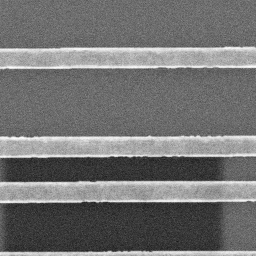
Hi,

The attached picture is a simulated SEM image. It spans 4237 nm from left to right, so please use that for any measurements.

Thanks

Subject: lines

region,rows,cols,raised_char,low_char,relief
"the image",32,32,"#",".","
................................
................................
................................
................................
................................
................................
################################
################################
................................
................................
................................
................................
................................
................................
................................
................................
................................
################################
################################
#######.........................
................................
................................
................................
################################
################################
................................
................................
................................
................................
................................
................................
................................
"